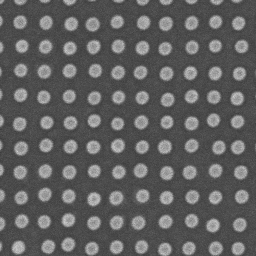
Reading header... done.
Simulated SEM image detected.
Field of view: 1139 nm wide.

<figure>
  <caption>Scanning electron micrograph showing a regular array of raised bodies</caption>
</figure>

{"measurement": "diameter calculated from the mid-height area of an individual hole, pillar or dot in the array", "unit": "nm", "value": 57.9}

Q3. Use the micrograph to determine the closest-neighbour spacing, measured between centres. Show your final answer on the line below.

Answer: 103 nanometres